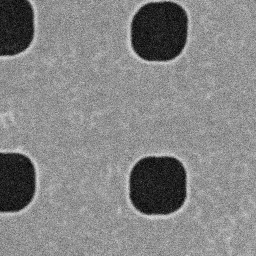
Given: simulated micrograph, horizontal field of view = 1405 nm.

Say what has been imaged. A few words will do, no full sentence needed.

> holes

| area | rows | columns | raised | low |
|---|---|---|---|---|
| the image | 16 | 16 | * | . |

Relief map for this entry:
..*******..*****
..******....****
..******....****
.********..*****
****************
****************
****************
****************
****************
.***************
..******....****
..******....****
..******....****
****************
****************
****************